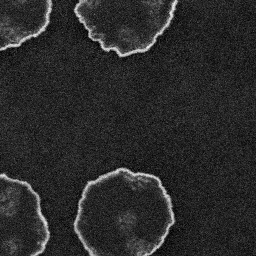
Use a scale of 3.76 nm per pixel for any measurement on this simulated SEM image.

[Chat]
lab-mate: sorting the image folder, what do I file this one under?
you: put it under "raised bodies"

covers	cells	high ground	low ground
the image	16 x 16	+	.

+++..++++++.....
+++..+++++......
++....++++......
................
................
................
................
................
................
................
................
++....++++......
++...++++++.....
+++..++++++.....
+++..+++++......
+++..+++++......